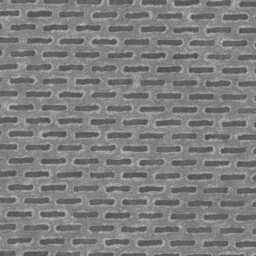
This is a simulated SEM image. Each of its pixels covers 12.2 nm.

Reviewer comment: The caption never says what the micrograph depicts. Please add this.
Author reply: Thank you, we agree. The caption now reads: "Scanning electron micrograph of a regular array of holes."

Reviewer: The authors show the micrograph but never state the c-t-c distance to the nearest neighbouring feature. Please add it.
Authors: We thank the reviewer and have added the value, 252 nm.